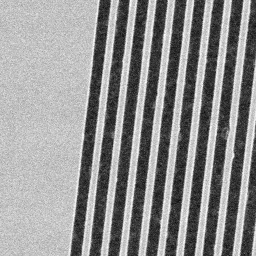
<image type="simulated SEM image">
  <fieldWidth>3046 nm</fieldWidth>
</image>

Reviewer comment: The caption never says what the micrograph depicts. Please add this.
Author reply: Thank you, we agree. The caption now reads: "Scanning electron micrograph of parallel lines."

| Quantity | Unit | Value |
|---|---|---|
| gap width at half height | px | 11.9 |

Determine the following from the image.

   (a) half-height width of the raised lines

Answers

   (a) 0.0813 um